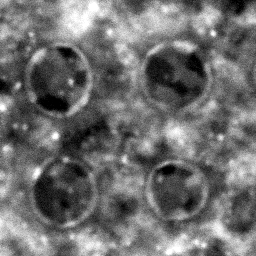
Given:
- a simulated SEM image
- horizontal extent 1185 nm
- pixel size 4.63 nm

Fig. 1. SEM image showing raised bodies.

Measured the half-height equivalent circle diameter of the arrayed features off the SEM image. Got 316 nanometers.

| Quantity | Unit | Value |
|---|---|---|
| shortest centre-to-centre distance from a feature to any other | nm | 522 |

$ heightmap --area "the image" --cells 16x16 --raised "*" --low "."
................
................
................
..***....****...
..****...****...
..****...****...
..***.....**....
................
................
................
..***.....**....
..****...****...
..****...****...
...**.....**....
................
................